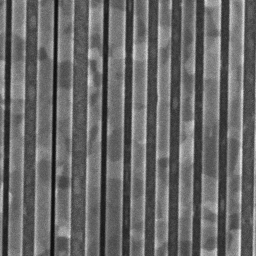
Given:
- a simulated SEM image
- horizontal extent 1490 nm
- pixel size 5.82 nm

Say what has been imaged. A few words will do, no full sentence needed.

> parallel lines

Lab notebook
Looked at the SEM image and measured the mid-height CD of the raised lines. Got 81.4 nanometers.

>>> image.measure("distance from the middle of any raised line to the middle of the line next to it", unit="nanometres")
141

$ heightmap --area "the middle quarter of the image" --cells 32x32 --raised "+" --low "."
++....+++..++++..++++...++...+++
++....+++..++++..++++...++...+++
++....+++..++++..++++...++...+++
++....+++..++++..++++...++...+++
++....+++..++++..++++...++...+++
++....+++..++++..++++...++...+++
++....+++..++++..++++...++...+++
++....+++..++++..++++...++...+++
++....+++..++++..++++...++...+++
++....+++..++++..++++...++...+++
++....+++..++++..++++..+++...+++
++....+++..++++..+++...+++...+++
++....+++..++++..+++...+++...+++
++....+++..++++..+++...+++...+++
++....+++..++++..+++...+++...+++
++....+++..++++..+++...+++...+++
++....+++..++++..+++...+++...+++
++....+++..++++..+++...+++...+++
++....+++..++++..+++...+++...+++
++....+++..++++..+++...+++...+++
++....+++..++++..+++...+++...+++
++....+++..++++..+++...+++...+++
++....+++..++++..+++...+++...+++
++....+++..++++..+++...+++...+++
++....+++..++++..+++...+++...+++
++....+++..++++..+++...+++...+++
++....+++..++++..+++...+++...+++
++....+++..+++...+++...+++...+++
++....+++..+++...+++...+++...+++
++....+++..+++...+++...+++...+++
+.....+++..+++...+++...+++...+++
+.....+++..+++...+++...+++...+++